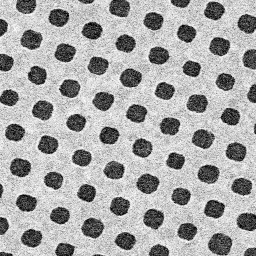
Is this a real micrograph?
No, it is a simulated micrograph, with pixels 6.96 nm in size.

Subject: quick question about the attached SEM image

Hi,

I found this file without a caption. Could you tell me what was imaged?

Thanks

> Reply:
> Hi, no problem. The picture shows a regular array of holes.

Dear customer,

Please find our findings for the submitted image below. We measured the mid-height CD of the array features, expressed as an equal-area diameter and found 0.142 um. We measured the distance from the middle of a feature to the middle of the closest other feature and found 245 nanometres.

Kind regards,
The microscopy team